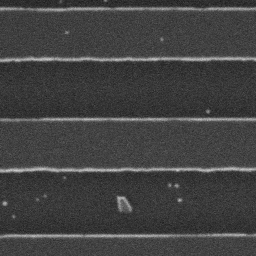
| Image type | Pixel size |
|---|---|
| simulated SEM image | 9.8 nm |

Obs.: lines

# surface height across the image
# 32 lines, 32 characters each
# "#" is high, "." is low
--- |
................................
################################
################################
################################
################################
################################
################################
######.#############...###......
................................
................................
................................
................................
................................
................................
................................
################################
################################
################################
################################
################################
################################
................................
................................
................................
................................
................................
................................
................................
................................
##########.#####################
################################
################################